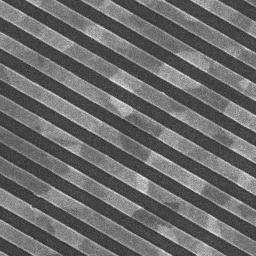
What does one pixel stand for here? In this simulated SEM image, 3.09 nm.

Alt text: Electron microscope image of parallel lines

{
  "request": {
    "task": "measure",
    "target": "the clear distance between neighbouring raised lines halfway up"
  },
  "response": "40.9 nanometers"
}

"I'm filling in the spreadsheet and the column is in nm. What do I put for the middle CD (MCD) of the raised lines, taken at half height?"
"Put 43.9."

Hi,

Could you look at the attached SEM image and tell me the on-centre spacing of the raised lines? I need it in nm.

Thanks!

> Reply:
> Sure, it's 84.2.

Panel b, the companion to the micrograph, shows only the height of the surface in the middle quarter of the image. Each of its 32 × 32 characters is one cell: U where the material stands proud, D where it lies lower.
DDDDDDUUUUUUUDDDDDDUUUUUUUDDDDDD
UDDDDDDUUUUUUUUDDDDDDUUUUUUUDDDD
UUDDDDDDDUUUUUUUDDDDDDDUUUUUUUDD
UUUUDDDDDDDUUUUUUUDDDDDDDUUUUUUD
UUUUUUDDDDDDDUUUUUUUDDDDDDUUUUUU
DUUUUUUDDDDDDDUUUUUUUUDDDDDDUUUU
DDUUUUUUUDDDDDDDUUUUUUUDDDDDDDUU
DDDDUUUUUUUDDDDDDDUUUUUUUDDDDDDU
DDDDDDUUUUUUUDDDDDDUUUUUUUUDDDDD
UDDDDDDUUUUUUUDDDDDDDUUUUUUUDDDD
UUDDDDDDDUUUUUUUDDDDDDDUUUUUUUDD
UUUUDDDDDDDUUUUUUUDDDDDDDUUUUUUU
UUUUUUDDDDDDDUUUUUUUDDDDDDUUUUUU
DUUUUUUUDDDDDDUUUUUUUDDDDDDDUUUU
DDDUUUUUUDDDDDDDUUUUUUUDDDDDDDUU
DDDDDUUUUUUUDDDDDDUUUUUUUDDDDDDD
DDDDDDUUUUUUUDDDDDDDUUUUUUUDDDDD
UDDDDDDDUUUUUUUDDDDDDDUUUUUUDDDD
UUUDDDDDDDUUUUUUDDDDDDDUUUUUUUDD
UUUUDDDDDDDDUUUUUUDDDDDDDUUUUUUU
UUUUUUDDDDDDDUUUUUUUDDDDDDDUUUUU
DUUUUUUUDDDDDDDUUUUUUUDDDDDDUUUU
DDDUUUUUUUDDDDDDDUUUUUUDDDDDDDUU
DDDDDUUUUUUUDDDDDDUUUUUUUDDDDDDD
DDDDDDDUUUUUUDDDDDDDUUUUUUUDDDDD
UDDDDDDDUUUUUUUDDDDDDDUUUUUUDDDD
UUUDDDDDDDUUUUUUUDDDDDDUUUUUUUDD
UUUUUDDDDDDDUUUUUUUDDDDDDUUUUUUU
UUUUUUUDDDDDDDUUUUUUDDDDDDDUUUUU
DDUUUUUUDDDDDDDUUUUUUUDDDDDDDUUU
DDDUUUUUUUDDDDDDDUUUUUUUDDDDDDUU
DDDDDUUUUUUUDDDDDDDUUUUUUUDDDDDD